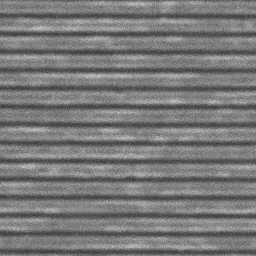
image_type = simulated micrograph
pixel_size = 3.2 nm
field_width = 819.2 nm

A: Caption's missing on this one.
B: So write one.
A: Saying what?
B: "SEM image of parallel lines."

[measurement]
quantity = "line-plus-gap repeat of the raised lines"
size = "58.1 nm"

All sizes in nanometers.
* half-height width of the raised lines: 38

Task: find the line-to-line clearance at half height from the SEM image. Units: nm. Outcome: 21.6